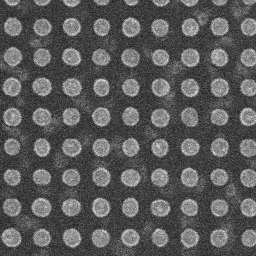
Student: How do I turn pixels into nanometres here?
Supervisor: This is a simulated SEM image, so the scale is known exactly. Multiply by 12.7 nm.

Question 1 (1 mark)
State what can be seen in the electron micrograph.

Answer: a regular array of raised bodies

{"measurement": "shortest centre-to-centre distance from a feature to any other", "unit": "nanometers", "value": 373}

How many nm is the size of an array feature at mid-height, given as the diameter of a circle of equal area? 211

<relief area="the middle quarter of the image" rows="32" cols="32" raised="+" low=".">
................++..............
................................
................................
................................
++++....+++....+++.....++.....++
++++....+++....++++...++++...+++
++++....+++....++++...++++....++
.+++.....+......++.....++.....++
................................
................................
................................
.++.....++......++......+.....++
++++...++++....++++...++++....++
++++...++++....++++...++++...+++
+++.....+++....+++....++++....++
.......................++......+
................................
................................
................................
+++.....+++....+++.....++.....++
++++....+++....++++...++++...+++
++++...++++....++++...++++....++
.++.....++......++.....++......+
................................
................................
................................
.++.....++.............++.....++
++++....+++....++++...++++....++
++++....+++...+++++...++++....++
++++....+++....+++....++++....++
................................
................................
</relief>